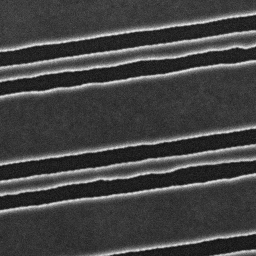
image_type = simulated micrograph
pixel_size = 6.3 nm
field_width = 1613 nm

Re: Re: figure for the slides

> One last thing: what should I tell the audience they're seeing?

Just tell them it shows lines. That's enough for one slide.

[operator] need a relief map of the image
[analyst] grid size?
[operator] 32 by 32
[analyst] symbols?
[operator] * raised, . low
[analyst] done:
********************************
********************************
***************************.....
*********************...........
*************..............*****
******..............************
.............*************......
......************..............
************............********
*****..............*************
...........*********************
.....***************************
********************************
********************************
********************************
********************************
*****************************...
**********************..........
***************..............***
********..............**********
*..............************.....
........*************...........
.***********...............*****
*******.............************
.............*******************
......**************************
********************************
********************************
********************************
******************************..
***********************.........
****************.............***